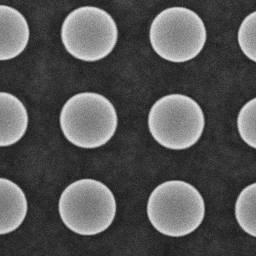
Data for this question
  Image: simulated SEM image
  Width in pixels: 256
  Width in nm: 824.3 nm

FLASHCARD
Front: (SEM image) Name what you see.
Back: raised bodies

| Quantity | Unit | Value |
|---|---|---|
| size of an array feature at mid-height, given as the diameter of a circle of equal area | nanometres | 178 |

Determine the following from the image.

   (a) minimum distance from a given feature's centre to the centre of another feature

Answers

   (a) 280 nm